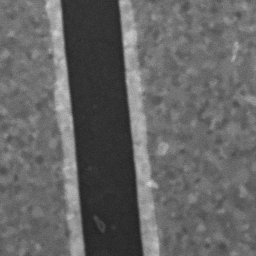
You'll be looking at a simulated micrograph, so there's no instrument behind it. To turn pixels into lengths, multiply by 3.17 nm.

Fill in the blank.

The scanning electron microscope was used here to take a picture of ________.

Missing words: one or a few lines or trenches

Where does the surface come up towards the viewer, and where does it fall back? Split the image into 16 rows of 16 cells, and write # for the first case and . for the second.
###.....########
####....########
####....########
####....########
####....########
####....########
####....########
####....########
####.....#######
####.....#######
#####....#######
#####....#######
#####....#######
#####....#######
#####....#######
#####....#######